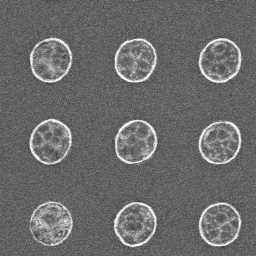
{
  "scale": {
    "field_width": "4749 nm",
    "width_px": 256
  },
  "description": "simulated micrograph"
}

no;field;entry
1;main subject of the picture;a regular array of raised bodies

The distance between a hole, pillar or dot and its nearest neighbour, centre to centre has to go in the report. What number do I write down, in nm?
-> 1520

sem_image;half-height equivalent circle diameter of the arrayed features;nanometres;769